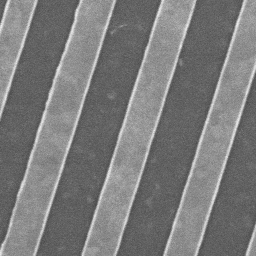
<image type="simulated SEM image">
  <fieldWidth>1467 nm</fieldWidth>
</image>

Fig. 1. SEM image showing one or a few lines or trenches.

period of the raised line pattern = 443 nm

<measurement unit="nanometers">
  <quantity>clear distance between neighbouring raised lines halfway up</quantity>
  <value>262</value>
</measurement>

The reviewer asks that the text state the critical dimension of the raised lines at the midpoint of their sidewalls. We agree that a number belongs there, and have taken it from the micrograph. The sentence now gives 183 nanometers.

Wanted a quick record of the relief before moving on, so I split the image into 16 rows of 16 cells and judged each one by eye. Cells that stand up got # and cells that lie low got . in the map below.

##...##...##...#
##...##...##...#
##..##...##....#
#...##...##...##
#...##...##...##
#..##...##....##
...##...##...##.
...##...##...##.
..###..###...##.
..##...##...##..
..##...##...##..
.###...##...##..
.##...##...##...
.##...##...##...
.##...##...##...
##...##...##....